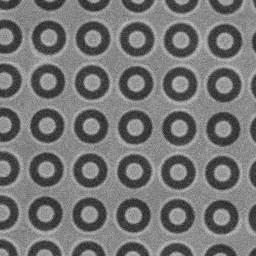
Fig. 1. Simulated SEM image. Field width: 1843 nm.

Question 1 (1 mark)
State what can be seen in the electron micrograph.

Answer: an array of small figures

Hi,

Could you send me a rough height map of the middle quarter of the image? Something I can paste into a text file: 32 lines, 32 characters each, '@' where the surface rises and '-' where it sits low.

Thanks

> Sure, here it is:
@@@@@----@@@@@@@@---@@@@@@@@@-@@
@@@@-------@@@@------@@@@@------
@@@--------@@@--------@@@@------
@@@---@@@---@@---@@@---@@---@@--
-@---@@@@---@@--@@@@---@---@@@@-
@@@--@@@@---@---@@@@--@@---@@@@-
@@@--------@@@---@@---@@@---@@--
@@@--------@@@--------@@@-------
@@@@-----@@@@@@-----@@@@@@------
@@@@@@@@@@@@@@@@@@@@@@@@@@@@---@
@@@@@@@@@@@@@@@@@@@@@@@@@@@@@@@@
@@@@@----@@@@@@@@--@@@@@@@@@@@@@
@@@@------@@@@@------@@@@@------
@@@--------@@@--------@@@-------
@@---@@@---@@@---@@---@@@---@@--
@@---@@@@--@@---@@@@--@@@--@@@@-
@@---@@@@--@@---@@@@--@@---@@@@-
@@@---@@---@@@---@@---@@@--@@@--
@@@-------@@@@-------@@@@-------
@@@@-----@@@@@@-----@@@@@@------
@@@@@@@@@@@@@@@@@-@@@@@@@@@----@
@@@@@@@@@@@@@@@@@@@@@@@@@@@@@@@@
@@@@@---@@@@@@@@---@@@@@@@@@-@@@
@@@-------@@@@-------@@@@@-----@
@@---------@@@--------@@@-------
@@---@@@---@@---@@@---@@---@@---
@@---@@@---@@---@@@@--@@---@@@--
@@---@@@---@@---@@@@--@@---@@@@-
@@@---@----@@@---@@---@@---@@@--
@@@-------@@@@-------@@@@-------
@@@@-----@@@@@@-----@@@@@@------
@@@@@@@@@@@@@@@@@@@@@@@@@@@@--@@